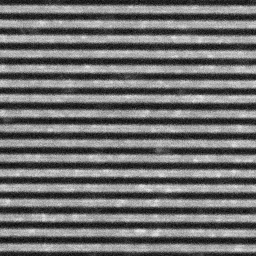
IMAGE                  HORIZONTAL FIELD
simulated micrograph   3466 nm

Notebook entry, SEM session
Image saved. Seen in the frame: parallel lines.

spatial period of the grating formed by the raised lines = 14.9 px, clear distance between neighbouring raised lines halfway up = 0.118 microns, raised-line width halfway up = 0.0829 um